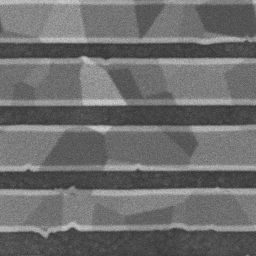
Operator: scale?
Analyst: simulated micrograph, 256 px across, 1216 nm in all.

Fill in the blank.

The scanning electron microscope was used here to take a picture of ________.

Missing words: one or a few lines or trenches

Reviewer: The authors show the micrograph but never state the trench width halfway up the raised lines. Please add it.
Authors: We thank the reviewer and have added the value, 112 nm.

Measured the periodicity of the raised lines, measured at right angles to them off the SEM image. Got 63.1 px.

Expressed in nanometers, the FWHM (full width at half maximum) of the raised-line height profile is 188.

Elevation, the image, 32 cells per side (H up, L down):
HHHHHHHHHHHHHHHHHHHHHHHHHHHHHHHH
HHHHHHHHHHHHHHHHHHHHHHHHHHHHHHHH
HHHHHHHHHHHHHHHHHHHHHHHHHHHHHHHH
HHHHHHHHHHHHHHHHHHHHHHHHHHHHHHHH
HHHHHHHHHHHHHHHHHHHHHHHHHHHHHHHH
LLLLLLLLLLLLLLLLLLLLLLLLLLLLLLLL
LLLLLLLLLLLLLLLLLLLLLLLLLLLLLLLL
LLLLLLLLLLHLLLLLLLLLLLLLLLLLLLLL
HHHHHHHHHHHHHHHHHHHHHHHHHHHHHHHH
HHHHHHHHHHHHHHHHHHHHHHHHHHHHHHHH
HHHHHHHHHHHHHHHHHHHHHHHHHHHHHHHH
HHHHHHHHHHHHHHHHHHHHHHHHHHHHHHHH
HHHHHHHHHHHHHHHHHHHHHHHHHHHHHHHH
LLLLLLLLLLLLLLLLLLLLLLLLLLLLLLLL
LLLLLLLLLLLLLLLLLLLLLLLLLLLLLLLL
LLLLLLLLLLLLLLLLLLLLLLLLLLLLLLLL
HHHHHHHHHHHHHHHHHHHHHHHHHHHHHHHH
HHHHHHHHHHHHHHHHHHHHHHHHHHHHHHHH
HHHHHHHHHHHHHHHHHHHHHHHHHHHHHHHH
HHHHHHHHHHHHHHHHHHHHHHHHHHHHHHHH
HHHHHHHHHHHHHHHHHHHHHHHHHHHHHHHH
LLLLLLLLLLLLLLLLLLLLLLLLLLLLLLLL
LLLLLLLLLLLLLLLLLLLLLLLLLLLLLLLL
LLLLLLLLLLLLLLLLLLLLLLLLLLLLLLLL
HHHHHHHHHHHHHHHHHHHHHHHHHHHHHHHH
HHHHHHHHHHHHHHHHHHHHHHHHHHHHHHHH
HHHHHHHHHHHHHHHHHHHHHHHHHHHHHHHH
HHHHHHHHHHHHHHHHHHHHHHHHHHHHHHHH
HHHHHHHHLLLLLHHLLLLLLLLHHHLHHHHH
LLLLLLLLLLLLLLLLLLLLLLLLLLLLLLLL
LLLLLLLLLLLLLLLLLLLLLLLLLLLLLLLL
LLLLLLLLLLLLLLLLLLLLLLLLLLLLLLLL